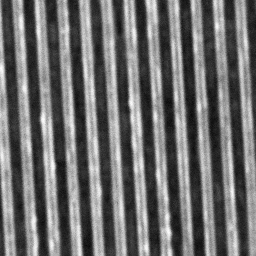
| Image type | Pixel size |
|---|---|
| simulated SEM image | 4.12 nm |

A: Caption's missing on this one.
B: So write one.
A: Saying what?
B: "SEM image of parallel lines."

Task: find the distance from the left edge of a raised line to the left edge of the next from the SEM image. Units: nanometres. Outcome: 91.7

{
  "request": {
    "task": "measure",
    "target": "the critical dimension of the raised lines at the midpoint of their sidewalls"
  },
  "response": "36 nanometres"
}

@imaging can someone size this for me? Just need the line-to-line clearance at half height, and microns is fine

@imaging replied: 0.0556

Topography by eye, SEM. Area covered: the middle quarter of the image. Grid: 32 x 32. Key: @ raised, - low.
@@---@@---@@@---@@----@@---@@---
@@---@@---@@@---@@----@@---@@---
@@---@@----@@---@@----@@---@@---
@@---@@----@@---@@----@@----@@--
@@---@@----@@---@@----@@----@@--
@@---@@----@@---@@@---@@----@@--
@@---@@----@@---@@@---@@----@@--
@@----@----@@---@@@---@@----@@--
@@----@@---@@---@@@---@@----@@--
@@----@@---@@---@@@---@@----@@--
@@----@@---@@---@@@---@@----@@--
@@----@@---@@----@@---@@----@@--
@@----@@---@@----@@----@----@@--
@@----@@---@@----@@----@@---@@--
@@----@@----@----@@----@@---@@--
@@----@@----@@---@@----@@---@@--
@@----@@----@@---@@----@@---@@--
-@@---@@----@@---@@----@@---@@--
-@@---@@----@@---@@----@@---@@--
-@@---@@----@@---@@----@@---@@--
-@@---@@----@@---@@----@@----@@-
-@@---@@----@@---@@----@@----@@-
-@@---@@----@@----@@---@@----@@-
-@@---@@----@@----@@---@@----@@-
-@@---@@@---@@----@@---@@----@@-
-@@---@@@---@@----@@---@@----@@-
-@@---@@@---@@----@@---@@----@@-
-@@----@@---@@----@@---@@----@@-
-@@----@@---@@----@@---@@----@@-
-@@----@@---@@----@@----@@---@@-
-@@----@@---@@----@@----@@---@@-
-@@----@@---@@----@@----@@---@@-